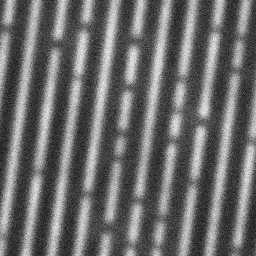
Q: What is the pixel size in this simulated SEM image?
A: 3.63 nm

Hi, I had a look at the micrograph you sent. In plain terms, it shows parallel lines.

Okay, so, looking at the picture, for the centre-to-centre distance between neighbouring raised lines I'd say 94.2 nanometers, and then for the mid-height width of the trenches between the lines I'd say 73.2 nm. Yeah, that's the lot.